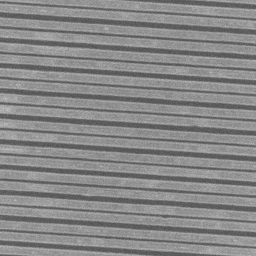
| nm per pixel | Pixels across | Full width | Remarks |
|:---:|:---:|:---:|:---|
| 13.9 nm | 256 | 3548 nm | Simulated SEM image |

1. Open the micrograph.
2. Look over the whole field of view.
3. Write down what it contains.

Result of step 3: parallel lines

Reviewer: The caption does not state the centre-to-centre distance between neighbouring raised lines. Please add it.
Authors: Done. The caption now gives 175 nm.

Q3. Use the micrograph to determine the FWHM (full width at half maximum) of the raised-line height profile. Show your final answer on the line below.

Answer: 102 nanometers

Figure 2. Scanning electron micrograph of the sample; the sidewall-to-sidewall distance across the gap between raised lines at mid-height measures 0.0639 micrometres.